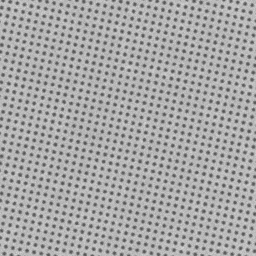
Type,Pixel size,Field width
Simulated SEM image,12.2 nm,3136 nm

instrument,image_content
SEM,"a regular array of holes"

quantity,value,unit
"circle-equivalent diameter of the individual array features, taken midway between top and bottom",53.6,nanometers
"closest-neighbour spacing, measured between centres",85.8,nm